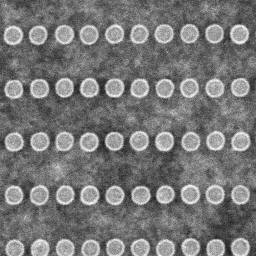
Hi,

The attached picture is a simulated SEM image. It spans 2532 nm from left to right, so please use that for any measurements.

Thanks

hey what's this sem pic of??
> a regular array of raised bodies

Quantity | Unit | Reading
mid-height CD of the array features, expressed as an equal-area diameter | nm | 175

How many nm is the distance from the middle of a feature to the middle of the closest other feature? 246